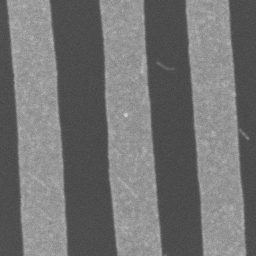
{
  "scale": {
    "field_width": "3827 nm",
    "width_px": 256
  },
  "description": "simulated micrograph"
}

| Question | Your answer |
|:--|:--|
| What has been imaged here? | one or a few lines or trenches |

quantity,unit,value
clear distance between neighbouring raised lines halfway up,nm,686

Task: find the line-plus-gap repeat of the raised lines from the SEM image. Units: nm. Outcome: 1330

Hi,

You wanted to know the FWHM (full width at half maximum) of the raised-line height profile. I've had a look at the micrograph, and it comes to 622 nm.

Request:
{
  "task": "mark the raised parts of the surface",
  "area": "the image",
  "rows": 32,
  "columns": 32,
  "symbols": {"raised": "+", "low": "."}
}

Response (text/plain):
.+++++.......+++++.....++++++...
.+++++.......+++++.....++++++...
.+++++.......+++++.....++++++...
.+++++.......+++++.....++++++...
.++++++......+++++......+++++...
.++++++......+++++......+++++...
..+++++......+++++......+++++...
..+++++......+++++......+++++...
..+++++......+++++......+++++...
..+++++......+++++......+++++...
..+++++......+++++......+++++...
..+++++......+++++......+++++...
..+++++......++++++.....+++++...
..+++++......++++++.....+++++...
..+++++.......+++++.....+++++...
..+++++.......+++++.....++++++..
..++++++......+++++.....++++++..
..++++++......+++++......+++++..
..++++++......+++++......+++++..
..++++++......+++++......+++++..
..++++++......+++++......+++++..
..++++++......+++++......+++++..
...+++++......+++++......+++++..
...+++++......+++++......+++++..
...+++++......++++++.....+++++..
...+++++......++++++.....+++++..
...+++++......++++++.....+++++..
...+++++......++++++.....+++++..
...+++++......++++++.....+++++..
...+++++......++++++.....+++++..
...+++++.......+++++......+++++.
...+++++.......+++++......+++++.